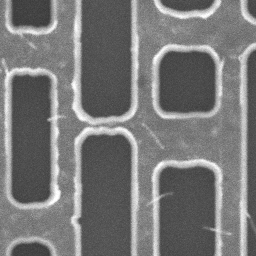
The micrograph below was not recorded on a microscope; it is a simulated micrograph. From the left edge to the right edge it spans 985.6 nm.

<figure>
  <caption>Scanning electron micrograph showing one or a few lines or trenches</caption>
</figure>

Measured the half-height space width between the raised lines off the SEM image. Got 211 nm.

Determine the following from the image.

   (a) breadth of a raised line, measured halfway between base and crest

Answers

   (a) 104 nm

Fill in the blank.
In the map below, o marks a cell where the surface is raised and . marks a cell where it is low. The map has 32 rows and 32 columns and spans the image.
o......ooo.......ooo.......oooo.
o......ooo.......ooooo...oooooo.
o......ooo.......ooooooooooooooo
oo....oooo.......ooooooooooooooo
oooooooooo.......ooooooooooooooo
oooooooooo.......ooooooooooooooo
oooooooooo.......oooo.....ooooo.
oooooooooo.......ooo.......oooo.
oooooooooo.......ooo.......ooo..
o.....oooo.......oo........ooo..
o......ooo.......oo........ooo..
o......ooo.......oo........ooo..
o......ooo.......oo........ooo..
o......ooo.......ooo.......ooo..
o......oooo.....oooooooooooooo..
o......ooooooooooooooooooooooo..
o......ooooo.ooooooooooooooooo..
o......ooo......oooooooooooooo..
o......ooo.......ooooooooooooo..
o......ooo.......ooooooooooooo..
o......ooo.......ooooooooooooo..
o......ooo.......ooo.......ooo..
o......ooo.......oo........ooo..
o......ooo.......oo........ooo..
o......ooo.......ooo.......ooo..
oo....oooo.......ooo.......ooo..
oooooooooo.......ooo.......ooo..
oooooooooo.......ooo.......ooo..
oooooooooo.......ooo.......ooo..
oooooooooo.......ooo.......ooo..
oo....oooo.......ooo.......ooo..
o......ooo.......ooo.......oooo.